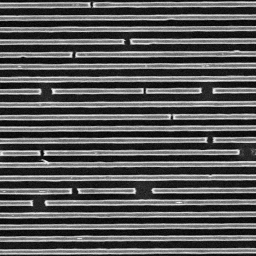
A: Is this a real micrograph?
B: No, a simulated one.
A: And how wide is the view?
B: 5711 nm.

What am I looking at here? parallel lines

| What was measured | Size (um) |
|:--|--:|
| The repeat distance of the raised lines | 0.275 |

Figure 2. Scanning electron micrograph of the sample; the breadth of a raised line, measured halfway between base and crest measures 100 nanometers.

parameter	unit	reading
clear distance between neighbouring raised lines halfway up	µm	0.162